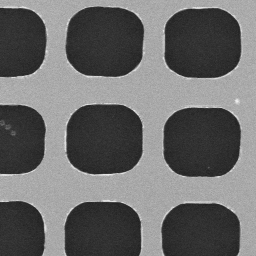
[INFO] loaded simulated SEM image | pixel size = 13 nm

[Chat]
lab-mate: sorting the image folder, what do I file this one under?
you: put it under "holes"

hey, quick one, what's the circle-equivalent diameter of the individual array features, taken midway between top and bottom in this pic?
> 77.9 pixels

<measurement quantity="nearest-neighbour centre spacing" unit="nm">1270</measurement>